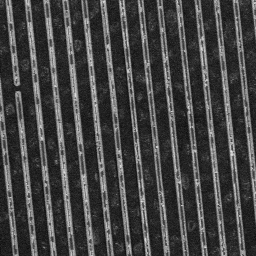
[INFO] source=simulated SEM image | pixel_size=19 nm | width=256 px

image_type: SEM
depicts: parallel lines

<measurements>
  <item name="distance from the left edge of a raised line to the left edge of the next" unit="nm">358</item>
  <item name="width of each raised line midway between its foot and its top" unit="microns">0.0898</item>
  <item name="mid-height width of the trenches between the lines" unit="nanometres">269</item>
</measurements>